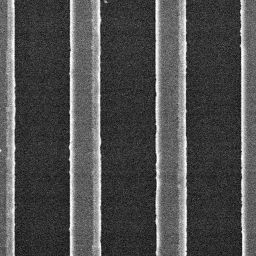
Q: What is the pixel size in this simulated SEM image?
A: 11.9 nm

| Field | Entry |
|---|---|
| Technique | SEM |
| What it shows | lines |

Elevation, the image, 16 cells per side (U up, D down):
UDDDUUDDDDUUDDDU
UDDDUUDDDDUUDDDU
UDDDUUDDDDUUDDDU
UDDDUUDDDDUUDDDU
UDDDUUDDDDUUDDDU
UDDDUUDDDDUUDDDU
UDDDUUDDDDUUDDDU
UDDDUUDDDDUUDDDU
UDDDUUDDDDUUDDDU
UDDDUUDDDDUUDDDU
UDDDUUDDDDUUDDDU
UDDDUUDDDDUUDDDU
UDDDUUDDDDUUDDDU
UDDDUUDDDDUUDDDU
UDDDUUDDDDUUDDDU
UDDDUUDDDDUUDDDU